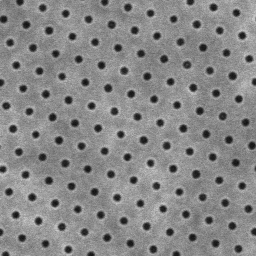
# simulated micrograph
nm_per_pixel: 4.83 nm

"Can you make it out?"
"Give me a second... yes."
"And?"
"a regular array of holes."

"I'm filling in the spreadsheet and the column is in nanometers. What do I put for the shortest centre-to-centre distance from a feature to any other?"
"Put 113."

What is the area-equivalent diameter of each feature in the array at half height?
44 nanometres